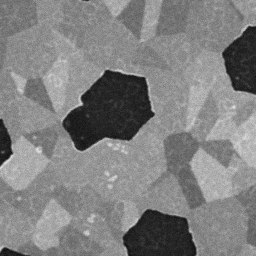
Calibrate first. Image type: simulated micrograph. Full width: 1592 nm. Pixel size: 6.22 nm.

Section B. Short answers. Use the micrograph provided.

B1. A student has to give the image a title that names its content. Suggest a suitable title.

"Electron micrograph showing holes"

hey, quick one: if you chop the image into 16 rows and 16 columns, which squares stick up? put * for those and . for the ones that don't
****************
****************
***************.
**************..
**************..
******...******.
*****....*******
****.....*******
.***....********
.***************
****************
****************
****************
*********..*****
********....****
********....****